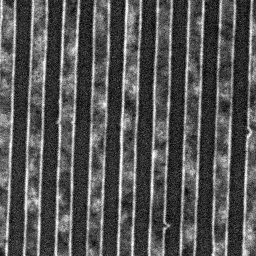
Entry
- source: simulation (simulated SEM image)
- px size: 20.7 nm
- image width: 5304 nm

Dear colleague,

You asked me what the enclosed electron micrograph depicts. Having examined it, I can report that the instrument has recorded parallel lines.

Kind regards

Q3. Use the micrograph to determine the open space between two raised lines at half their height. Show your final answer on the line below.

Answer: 355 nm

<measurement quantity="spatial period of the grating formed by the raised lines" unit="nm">648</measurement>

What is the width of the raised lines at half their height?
300 nanometres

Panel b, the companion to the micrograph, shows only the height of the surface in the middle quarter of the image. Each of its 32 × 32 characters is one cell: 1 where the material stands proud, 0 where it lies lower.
11100001111000011100000111000001
11100001111000011100000111000001
11100001111000011100000111000001
11100001111000011100000111000001
11100001111000011100000111000001
11100001111000011100000111000001
11100001110000011100000111000001
11100001110000011100000111000001
11100001110000011100000111000001
11100001111000011100000111000001
11100001111000011100000111000011
11100001111000011100000111000011
11100001111000011100000111000011
11100001110000011100001111000011
11000001110000011100000111000011
11000001110000111100000111000011
11000001110000111100000111000011
11000001110000111100000111000011
11000001110000111100000111000011
11000001110000111100001111000011
11000001110000011100001111000011
11000001110000111100001111000011
11000001110000111100001111000011
11000001110000111100001111000011
11000001110000111100001111000011
11000001110000111100001110000011
11000001110000111100001110000011
11000001110000111100001110000011
11000001110000111100001110000011
11000001110000111100001110000011
11000011110000111100001110000011
11000011110000111100001110000011